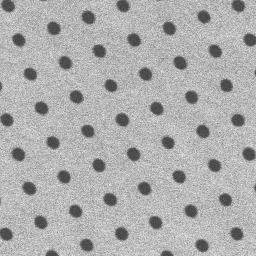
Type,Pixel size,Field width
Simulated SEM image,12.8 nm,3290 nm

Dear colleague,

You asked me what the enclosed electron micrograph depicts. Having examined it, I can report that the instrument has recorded a regular array of holes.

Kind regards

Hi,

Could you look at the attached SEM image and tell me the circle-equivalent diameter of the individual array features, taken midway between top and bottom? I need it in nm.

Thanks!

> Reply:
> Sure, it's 165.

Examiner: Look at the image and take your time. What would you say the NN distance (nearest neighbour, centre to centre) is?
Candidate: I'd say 462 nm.